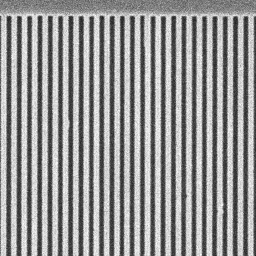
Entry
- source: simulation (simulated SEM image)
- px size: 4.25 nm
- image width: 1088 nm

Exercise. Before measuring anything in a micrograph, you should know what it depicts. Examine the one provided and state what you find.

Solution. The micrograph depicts parallel lines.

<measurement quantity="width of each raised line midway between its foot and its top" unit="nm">20.2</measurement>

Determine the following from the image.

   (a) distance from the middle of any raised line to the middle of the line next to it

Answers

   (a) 43.8 nanometers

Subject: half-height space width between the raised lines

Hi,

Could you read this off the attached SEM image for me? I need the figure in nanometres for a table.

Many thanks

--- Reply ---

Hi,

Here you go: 20.2